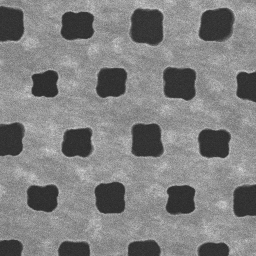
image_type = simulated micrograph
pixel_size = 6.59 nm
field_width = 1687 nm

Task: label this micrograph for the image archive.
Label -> a regular array of holes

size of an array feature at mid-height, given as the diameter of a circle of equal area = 209 nm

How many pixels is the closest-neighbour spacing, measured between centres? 65.4